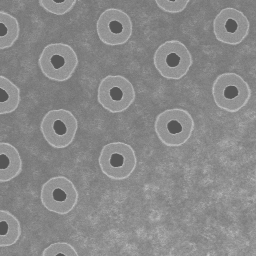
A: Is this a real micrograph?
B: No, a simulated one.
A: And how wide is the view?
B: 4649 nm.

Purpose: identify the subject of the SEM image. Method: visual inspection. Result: a regular array of ring-shaped raised bodies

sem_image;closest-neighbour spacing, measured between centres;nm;1190